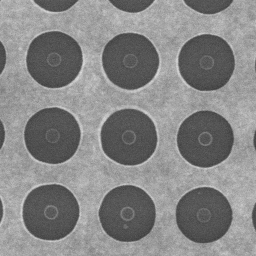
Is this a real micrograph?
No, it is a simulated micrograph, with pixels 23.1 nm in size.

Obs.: an array of small figures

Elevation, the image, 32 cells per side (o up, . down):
oooo.....ooooo.....oooo......ooo
oooooo..oooooooo..ooooooo...oooo
oooooooooooooooooooooooooooooooo
oooooooooooooooooooooooooooooooo
ooooo....ooooo....oooooo...ooooo
oooo......ooo......oooo......ooo
.oo.......ooo.......oo.......ooo
.oo.......ooo.......oo.......ooo
.oo.......ooo.......oo.......ooo
oooo......ooo......oooo......ooo
ooooo....ooooo.....oooo.....oooo
oooooooooooooooooooooooooooooooo
oooooooooooooooooooooooooooooooo
oooooo..ooooooo..ooooooooooooooo
oooo.....oooo......ooooo....oooo
ooo.......ooo......oooo......ooo
.oo.......oo........oo.......ooo
.oo.......oo........oo.......ooo
ooo.......ooo.......oo.......ooo
oooo.....oooo......oooo......ooo
oooooo..ooooooo...oooooo....oooo
oooooooooooooooooooooooooooooooo
oooooooooooooooooooooooooooooooo
oooo....oooooo....oooooo...ooooo
ooo......oooo......oooo.....oooo
ooo.......ooo......ooo.......ooo
.oo.......oo........oo.......oo.
ooo.......oo.......ooo.......oo.
ooo......oooo......ooo.......ooo
oooo....oooooo....ooooo.....oooo
oooooooooooooooooooooooooooooooo
oooooooooooooooooooooooooooooooo